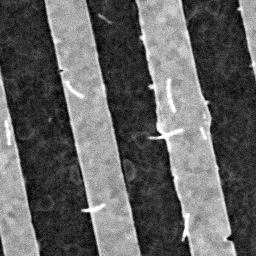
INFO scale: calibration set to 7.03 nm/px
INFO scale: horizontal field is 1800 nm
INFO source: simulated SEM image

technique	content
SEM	one or a few lines or trenches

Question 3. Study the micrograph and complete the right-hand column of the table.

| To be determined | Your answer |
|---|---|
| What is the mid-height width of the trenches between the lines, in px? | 54.2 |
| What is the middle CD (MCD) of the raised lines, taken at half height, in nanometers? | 275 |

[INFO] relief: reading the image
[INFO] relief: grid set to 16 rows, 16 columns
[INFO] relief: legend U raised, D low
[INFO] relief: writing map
DDDUUDDDDUUDDDDU
DDDUUUDDDUUUDDDU
DDDUUUDDDUUUDDDU
DDDDUUDDDUUUDDDD
DDDDUUDDDUUUDDDD
DDDDUUUDDDUUUDDD
DDDDUUUDDDUUUDDD
UDDDUUUDDDUUUDDD
UDDDDUUDDDUUUDDD
UDDDDUUDDDDUUDDD
UDDDDUUUDDDUUUDD
UDDDDUUUDDDUUUDD
UUDDDDUUDDDUUUDD
UUDDDDUUDDDUUUDD
UUDDDDUUDDDDUUDD
UUDDDDUUUDDDUUUD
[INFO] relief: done